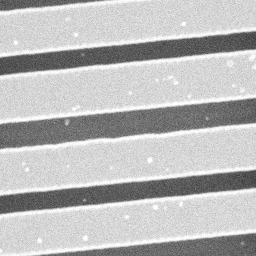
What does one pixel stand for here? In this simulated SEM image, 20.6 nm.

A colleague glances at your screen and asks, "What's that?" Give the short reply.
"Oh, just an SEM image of lines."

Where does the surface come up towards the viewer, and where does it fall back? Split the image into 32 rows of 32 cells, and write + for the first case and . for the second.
..........++++++++++++++++++++++
++++++++++++++++++++++++++++++++
++++++++++++++++++++++++++++++++
++++++++++++++++++++++++++++++++
++++++++++++++++++++++++++......
++++++++++++++++................
++++++.......................+++
....................++++++++++++
..........++++++++++++++++++++++
++++++++++++++++++++++++++++++++
++++++++++++++++++++++++++++++++
++++++++++++++++++++++++++++++++
+++++++++++++++++++++++++++++...
+++++++++++++++++++.............
+++++++++.......................
...............................+
......................++++++++++
...........+++++++++++++++++++++
..++++++++++++++++++++++++++++++
++++++++++++++++++++++++++++++++
++++++++++++++++++++++++++++++++
++++++++++++++++++++++++++++....
+++++++++++++++++++.............
+++++++++.......................
.......................+++++++++
.............+++++++++++++++++++
...+++++++++++++++++++++++++++++
++++++++++++++++++++++++++++++++
++++++++++++++++++++++++++++++++
++++++++++++++++++++++++++++....
++++++++++++++++++..............
++++++++........................